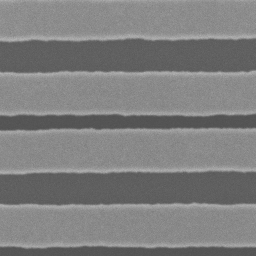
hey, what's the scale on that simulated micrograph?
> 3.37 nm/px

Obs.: lines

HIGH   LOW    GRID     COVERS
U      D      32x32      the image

UUUUUUUUUUUUUUUUUUUUUUUUUUUUUUUU
UUUUUUUUUUUUUUUUUUUUUUUUUUUUUUUU
UUUUUUUUUUUUUUUUUUUUUUUUUUUUUUUU
UUUUUUUUUUUUUUUUUUUUUUUUUUUUUUUU
UUUUUUUUUUUUUUUUUUUUUUUUUUUUUUUU
DDDDDDDDDDDDDDDDDDDDDDDDDDDDDDDD
DDDDDDDDDDDDDDDDDDDDDDDDDDDDDDDD
DDDDDDDDDDDDDDDDDDDDDDDDDDDDDDDD
DDDDDDDDDDDDDDDDDDDDDDDDDDDDDDDD
UUUUUUUUUUUUUUUUUUUUUUUUUUUUUUUU
UUUUUUUUUUUUUUUUUUUUUUUUUUUUUUUU
UUUUUUUUUUUUUUUUUUUUUUUUUUUUUUUU
UUUUUUUUUUUUUUUUUUUUUUUUUUUUUUUU
UUUUUUUUUUUUUUUUUUUUUUUUUUUUUUUU
DDDDDDDDDDDDDDDDDDDDDDDDDDDDDDDD
DDDDDDDDDDDDDDDDDDDDDDDDDDDDDDDD
UUUUUUUUUUUUUUUUUUUUUUUUUUUUUUUU
UUUUUUUUUUUUUUUUUUUUUUUUUUUUUUUU
UUUUUUUUUUUUUUUUUUUUUUUUUUUUUUUU
UUUUUUUUUUUUUUUUUUUUUUUUUUUUUUUU
UUUUUUUUUUUUUUUUUUUUUUUUUUUUUUUU
UUUUUUUUUUUUUUUDUDDUUUDDDDDDDDDD
DDDDDDDDDDDDDDDDDDDDDDDDDDDDDDDD
DDDDDDDDDDDDDDDDDDDDDDDDDDDDDDDD
DDDDDDDDDDDDDDDDDDDDDDDDDDDDDDDD
DDDDDDDDDDDDDDDDDDDDDUUUUUDDDDUD
UUUUUUUUUUUUUUUUUUUUUUUUUUUUUUUU
UUUUUUUUUUUUUUUUUUUUUUUUUUUUUUUU
UUUUUUUUUUUUUUUUUUUUUUUUUUUUUUUU
UUUUUUUUUUUUUUUUUUUUUUUUUUUUUUUU
UUUUUUUUUUUUUUUUUUUUUUUUUUUUUUUU
DDDDDDDDDDDDDDDDDDDDDDDDDDDDDDDD